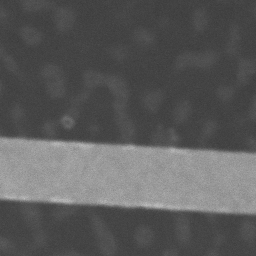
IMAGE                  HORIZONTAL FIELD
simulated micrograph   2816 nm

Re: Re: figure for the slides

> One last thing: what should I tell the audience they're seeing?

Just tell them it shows one or a few lines or trenches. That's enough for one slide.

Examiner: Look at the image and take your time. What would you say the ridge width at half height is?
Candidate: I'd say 652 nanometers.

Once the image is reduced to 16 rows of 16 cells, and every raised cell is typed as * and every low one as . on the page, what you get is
................
................
................
................
................
................
................
................
................
**************..
****************
****************
..**************
................
................
................